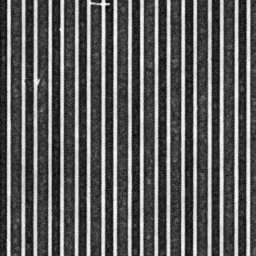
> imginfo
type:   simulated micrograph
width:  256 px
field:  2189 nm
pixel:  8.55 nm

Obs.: parallel lines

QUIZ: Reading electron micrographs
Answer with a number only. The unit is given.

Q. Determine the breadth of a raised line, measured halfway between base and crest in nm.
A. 21.4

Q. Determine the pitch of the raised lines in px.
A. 13.3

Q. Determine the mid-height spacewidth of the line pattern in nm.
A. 86.6